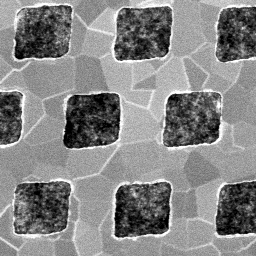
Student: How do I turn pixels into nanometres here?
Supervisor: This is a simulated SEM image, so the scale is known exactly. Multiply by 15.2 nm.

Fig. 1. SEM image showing holes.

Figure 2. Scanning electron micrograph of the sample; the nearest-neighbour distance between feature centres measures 1520 nm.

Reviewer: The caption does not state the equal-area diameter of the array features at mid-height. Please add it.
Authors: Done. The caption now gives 919 nm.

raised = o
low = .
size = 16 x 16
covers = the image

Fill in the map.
oo..ooooo.oooo..
o....oo....ooo..
o...ooo....ooo..
o...ooo...oooo..
oooooooooooooooo
oooooooooooooooo
.ooo....oo....oo
.ooo....oo....oo
.ooo...ooo....oo
oooooooooooooooo
oooooooooooooooo
o...oooo..oooo..
o...ooo....ooo..
o...ooo....ooo..
o...ooo...oooo..
oooooooooooooooo